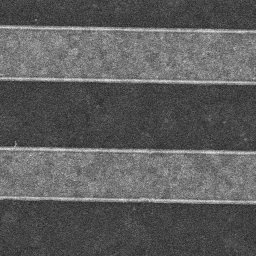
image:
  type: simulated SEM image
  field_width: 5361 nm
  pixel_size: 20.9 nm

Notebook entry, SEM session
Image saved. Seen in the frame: one or a few lines or trenches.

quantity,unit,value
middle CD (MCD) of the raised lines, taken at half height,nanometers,1030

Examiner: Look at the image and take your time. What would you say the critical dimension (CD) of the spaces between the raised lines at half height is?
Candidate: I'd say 1480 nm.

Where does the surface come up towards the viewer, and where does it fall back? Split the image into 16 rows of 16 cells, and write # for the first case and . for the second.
................
................
################
################
################
................
................
................
................
###########.....
################
################
...........#####
................
................
................